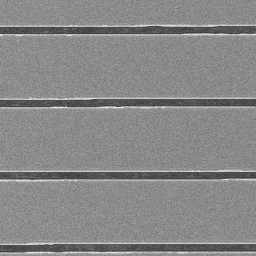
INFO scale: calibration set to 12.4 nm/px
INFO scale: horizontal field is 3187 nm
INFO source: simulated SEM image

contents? lines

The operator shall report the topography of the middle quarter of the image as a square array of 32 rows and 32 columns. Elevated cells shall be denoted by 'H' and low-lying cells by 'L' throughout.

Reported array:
HHHHHHHHHHHHHHHHHHHHHHHHHHHHHHHH
HHHHHHHHHHHHHHHHHHHHHHHHHHHHHHHH
HHHHHHHHHHHHHHHHHHHHHHHHHHHHHHHH
HHHHHHHHHHHHHHHHHHHHHHHHHHHHHHHH
HHHHHHHHHHHHHHHHHHHHHHHHHHHHHHHH
HHHHHHHHHHHHHHHHHHHHHHHHHHHHHHHH
HHHHHHHHHHHHHHHHHHHHHHHHHHHHHHHH
HHHHHHHHHHHHHHHHHHHHHHHHHHHHHHHH
HHHHHHHHHHHHHHHHHHHHHHHHHHHHHHHH
LLLLLLLLLLLLLLLLLLLLLLLLLLLLLLLL
LLLLLLLLLLLLLLLLLLLLLLLLLLLLLLLL
HHHHHHHHHHHHHHHHHHHHHHHHHHHHHHHH
HHHHHHHHHHHHHHHHHHHHHHHHHHHHHHHH
HHHHHHHHHHHHHHHHHHHHHHHHHHHHHHHH
HHHHHHHHHHHHHHHHHHHHHHHHHHHHHHHH
HHHHHHHHHHHHHHHHHHHHHHHHHHHHHHHH
HHHHHHHHHHHHHHHHHHHHHHHHHHHHHHHH
HHHHHHHHHHHHHHHHHHHHHHHHHHHHHHHH
HHHHHHHHHHHHHHHHHHHHHHHHHHHHHHHH
HHHHHHHHHHHHHHHHHHHHHHHHHHHHHHHH
HHHHHHHHHHHHHHHHHHHHHHHHHHHHHHHH
HHHHHHHHHHHHHHHHHHHHHHHHHHHHHHHH
HHHHHHHHHHHHHHHHHHHHHHHHHHHHHHHH
HHHHHHHHHHHHHHHHHHHHHHHHHHHHHHHH
HHHHHHHHHHHHHHHHHHHHHHHHHHHHHHHH
HHHHHHHHHHHHHHHHHHHHHHHHHHHHHHHH
HHHHHHHHHHHHHHHHHHHHHHHHHHHHHHHH
LLLLLLLLLLLLLLLLLLLLLLLLLLLLLLLL
LLLLLLLLLLLLLLLLLLLLLLLLLLLLLLLL
HHHHHHHHHHHHHHHHHHHHHHHHHHHHHHHH
HHHHHHHHHHHHHHHHHHHHHHHHHHHHHHHH
HHHHHHHHHHHHHHHHHHHHHHHHHHHHHHHH